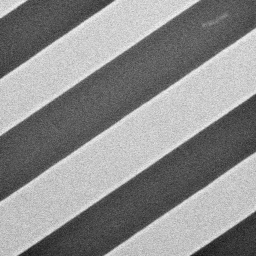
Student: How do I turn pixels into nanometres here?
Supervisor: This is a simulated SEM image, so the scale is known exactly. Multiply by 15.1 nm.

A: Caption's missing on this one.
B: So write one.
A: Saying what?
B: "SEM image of lines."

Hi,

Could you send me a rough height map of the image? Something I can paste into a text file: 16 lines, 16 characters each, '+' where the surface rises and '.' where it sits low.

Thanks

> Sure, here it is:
+......+++++....
.....+++++......
....+++++......+
..+++++......+++
.+++++......++++
++++.......+++++
+++......++++++.
+.......++++++..
......++++++....
.....++++++.....
...++++++......+
..++++++.....+++
++++++......++++
+++++.....+++++.
+++......+++++..
++.....++++++...